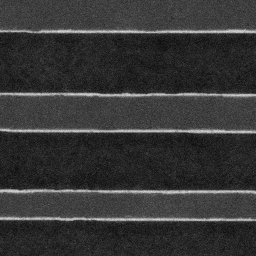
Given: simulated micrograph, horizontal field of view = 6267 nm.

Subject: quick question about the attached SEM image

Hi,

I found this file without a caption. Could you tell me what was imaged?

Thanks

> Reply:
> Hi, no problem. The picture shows lines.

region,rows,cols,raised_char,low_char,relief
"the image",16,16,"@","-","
@@@@@@@@@@@@@@@@
@@@@@@@@@@@@@@@@
----------------
----------------
----------------
----------------
@@@@@@@@@@@@@@@@
@@@@@@@@@@@@@@@@
----------------
----------------
----------------
----------------
@@@@@@@@@@@@@@@@
@@@@@@@@@@@@@@@@
----------------
----------------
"